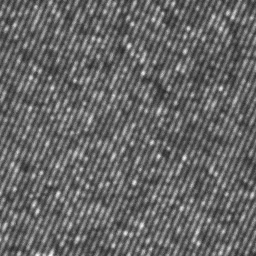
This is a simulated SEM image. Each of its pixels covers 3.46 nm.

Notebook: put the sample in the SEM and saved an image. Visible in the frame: parallel lines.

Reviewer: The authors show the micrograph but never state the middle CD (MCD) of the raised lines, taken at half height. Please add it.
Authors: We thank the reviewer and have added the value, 5.5 nm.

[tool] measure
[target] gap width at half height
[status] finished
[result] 4.02 px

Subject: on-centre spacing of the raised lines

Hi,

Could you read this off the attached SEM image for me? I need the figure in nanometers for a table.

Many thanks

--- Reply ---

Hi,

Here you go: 20.6